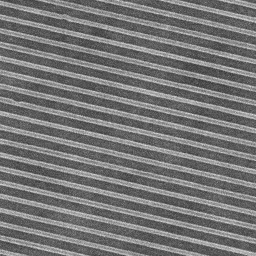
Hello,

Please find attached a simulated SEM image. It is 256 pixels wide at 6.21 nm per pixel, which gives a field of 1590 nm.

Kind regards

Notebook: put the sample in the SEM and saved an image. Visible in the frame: parallel lines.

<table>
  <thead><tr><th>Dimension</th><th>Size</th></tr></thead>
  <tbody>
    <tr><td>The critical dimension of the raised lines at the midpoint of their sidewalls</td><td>28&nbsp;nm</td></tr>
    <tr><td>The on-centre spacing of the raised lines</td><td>83.7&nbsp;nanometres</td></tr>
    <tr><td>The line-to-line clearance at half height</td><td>56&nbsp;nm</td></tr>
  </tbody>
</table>